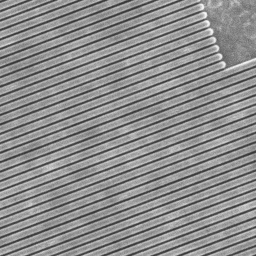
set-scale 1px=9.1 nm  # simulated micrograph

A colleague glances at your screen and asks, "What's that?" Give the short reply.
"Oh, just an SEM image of parallel lines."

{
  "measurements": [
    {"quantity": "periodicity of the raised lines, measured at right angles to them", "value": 80.4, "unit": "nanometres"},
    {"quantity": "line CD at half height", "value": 54.4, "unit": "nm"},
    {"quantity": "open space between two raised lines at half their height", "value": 26.6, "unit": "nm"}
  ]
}